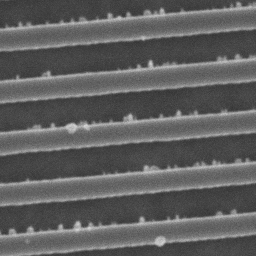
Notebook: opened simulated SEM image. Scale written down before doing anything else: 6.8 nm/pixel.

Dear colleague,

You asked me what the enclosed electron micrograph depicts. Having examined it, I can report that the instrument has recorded lines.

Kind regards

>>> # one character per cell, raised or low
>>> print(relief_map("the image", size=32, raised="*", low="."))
................................
........................********
..............******************
..******************************
**********************..........
**********......................
................................
..............................**
..................**************
........************************
***************************.....
***************.................
****............................
................................
........................********
.............*******************
..******************************
**********************..........
*********.......................
................................
..............................**
..................**************
.......*************************
************************........
***************.................
***.............................
................................
.......................*********
...........*********************
******************************..
******************.*............
*********.......................